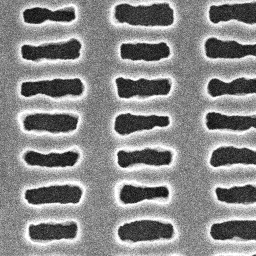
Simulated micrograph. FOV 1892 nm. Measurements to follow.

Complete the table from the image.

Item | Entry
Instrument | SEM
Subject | a regular array of holes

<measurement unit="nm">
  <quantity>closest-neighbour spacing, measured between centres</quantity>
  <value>266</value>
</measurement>